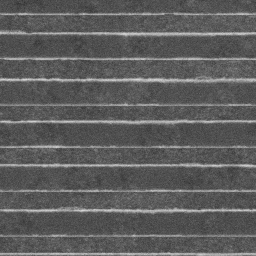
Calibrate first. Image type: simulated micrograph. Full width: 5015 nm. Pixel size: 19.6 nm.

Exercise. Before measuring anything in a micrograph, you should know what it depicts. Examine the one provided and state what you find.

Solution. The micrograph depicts lines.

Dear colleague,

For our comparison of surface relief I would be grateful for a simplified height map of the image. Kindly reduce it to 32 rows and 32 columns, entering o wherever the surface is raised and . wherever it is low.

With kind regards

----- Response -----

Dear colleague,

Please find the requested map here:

oooooooooooooooooooooooooooooooo
oooooooooooooooooooooooooooooooo
................................
................................
oooooooooooooooooooooooooooooooo
oooooooooooooooooooooooooooooooo
oooooooooooooooooooooooooooooooo
................................
................................
................................
oooooooooooooooooooooooooooooooo
oooooooooooooooooooooooooooooooo
oooooooooooooooooooooooooooooooo
................................
................................
oooooooooooooooooooooooooooooooo
oooooooooooooooooooooooooooooooo
oooooooooooooooooooooooooooooooo
................................
................................
................................
oooooooooooooooooooooooooooooooo
oooooooooooooooooooooooooooooooo
oooooooooooooooooooooooooooooooo
................................
................................
oooooooooooooooooooooooooooooooo
oooooooooooooooooooooooooooooooo
oooooooooooooooooooooooooooooooo
................................
................................
................................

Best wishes